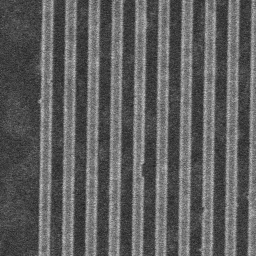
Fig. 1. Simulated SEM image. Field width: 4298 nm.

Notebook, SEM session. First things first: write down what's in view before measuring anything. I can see parallel lines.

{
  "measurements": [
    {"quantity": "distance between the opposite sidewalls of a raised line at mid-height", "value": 0.141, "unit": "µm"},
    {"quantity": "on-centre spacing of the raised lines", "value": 390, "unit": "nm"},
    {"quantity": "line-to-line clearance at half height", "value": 14.9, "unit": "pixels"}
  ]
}